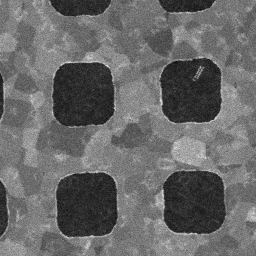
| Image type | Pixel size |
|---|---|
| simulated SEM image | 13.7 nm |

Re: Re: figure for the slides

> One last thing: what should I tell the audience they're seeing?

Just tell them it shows holes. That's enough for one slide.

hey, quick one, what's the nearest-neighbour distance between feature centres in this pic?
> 1.48 µm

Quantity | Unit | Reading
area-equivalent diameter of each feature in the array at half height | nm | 931